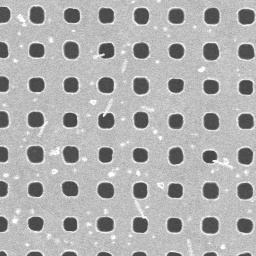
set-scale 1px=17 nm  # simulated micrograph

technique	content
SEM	a regular array of holes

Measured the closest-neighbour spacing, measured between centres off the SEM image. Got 582 nm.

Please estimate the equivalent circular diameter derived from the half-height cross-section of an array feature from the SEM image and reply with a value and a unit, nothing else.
278 nanometers